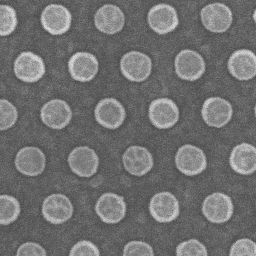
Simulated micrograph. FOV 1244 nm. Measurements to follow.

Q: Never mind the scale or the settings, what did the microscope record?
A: a regular array of raised bodies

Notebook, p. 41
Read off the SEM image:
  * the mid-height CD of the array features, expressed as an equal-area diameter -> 139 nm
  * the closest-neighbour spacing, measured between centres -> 0.259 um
